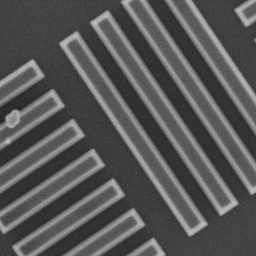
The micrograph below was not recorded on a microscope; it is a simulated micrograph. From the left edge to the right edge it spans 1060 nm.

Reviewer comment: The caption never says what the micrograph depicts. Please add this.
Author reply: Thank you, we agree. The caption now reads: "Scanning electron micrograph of groups of lines, slits or small figures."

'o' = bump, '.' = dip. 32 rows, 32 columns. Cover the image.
................oo...ooo.......o
................ooo...ooo.....oo
............oo...ooo...oo.....oo
............ooo...oo...ooo......
.........o...oo...ooo...ooo.....
........oo...ooo...ooo...oo.....
........ooo...ooo...oo...ooo....
.........ooo...oo...ooo...ooo...
...oo.....ooo..ooo...ooo...oo...
.oooo.....ooo...ooo...oo...ooo..
oooo.......ooo...ooo..ooo...ooo.
oo..........oo...ooo...ooo...oo.
o....oo.....ooo...ooo...oo...ooo
....ooo......ooo...ooo..ooo...oo
.ooooo........ooo..ooo...ooo...o
oooo..........ooo...ooo...oo...o
ooo....ooo.....ooo...ooo..ooo...
oo....ooo.......ooo..ooo...ooo..
....oooo........ooo...ooo...oo..
...oooo....o.....ooo...ooo..ooo.
.oooo....oooo.....ooo..ooo...ooo
oooo....oooo.......oo...ooo...oo
oo....oooo.........ooo...ooo..oo
o....oooo....oo.....ooo...oo...o
...oooo....oooo......oo...ooo...
..oooo....oooo.......ooo...oo...
oooo....oooo..........ooo.......
ooo....oooo....oo......oo.......
o....oooo....oooo......oo.......
....oooo....oooo................
..oooo....oooo....o.............
..ooo....oooo....ooo............